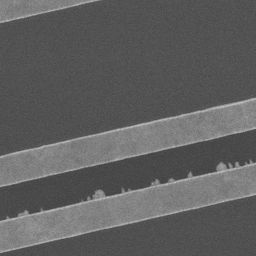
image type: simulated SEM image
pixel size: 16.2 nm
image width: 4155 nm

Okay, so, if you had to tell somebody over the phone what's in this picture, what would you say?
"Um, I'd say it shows lines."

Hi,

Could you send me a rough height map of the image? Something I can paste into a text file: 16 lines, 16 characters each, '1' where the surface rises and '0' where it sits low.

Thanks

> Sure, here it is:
1111000000000000
0000000000000000
0000000000000000
0000000000000000
0000000000000000
0000000000000000
0000000000000011
0000000000111111
0000011111111100
0111111111000000
1111100000000001
1000000000111111
0000001111111100
0111111111000000
1111110000000000
1000000000000000